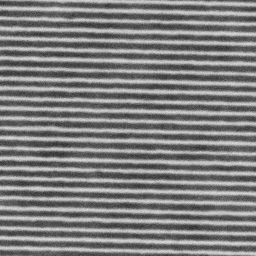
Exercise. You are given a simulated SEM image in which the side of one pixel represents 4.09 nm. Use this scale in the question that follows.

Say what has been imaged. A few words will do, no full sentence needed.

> parallel lines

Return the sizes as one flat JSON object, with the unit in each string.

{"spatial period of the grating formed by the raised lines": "40.8 nm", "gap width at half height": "28.6 nanometers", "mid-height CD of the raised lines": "14.3 nm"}